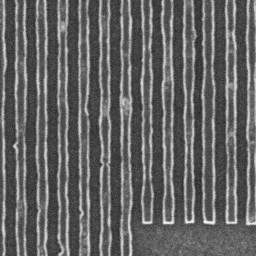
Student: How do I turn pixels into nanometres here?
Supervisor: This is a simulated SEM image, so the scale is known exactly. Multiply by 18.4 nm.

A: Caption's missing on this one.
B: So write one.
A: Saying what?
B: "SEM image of parallel lines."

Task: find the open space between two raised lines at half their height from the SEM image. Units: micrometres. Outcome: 0.233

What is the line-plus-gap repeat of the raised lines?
387 nanometres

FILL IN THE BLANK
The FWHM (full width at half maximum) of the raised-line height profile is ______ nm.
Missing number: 150